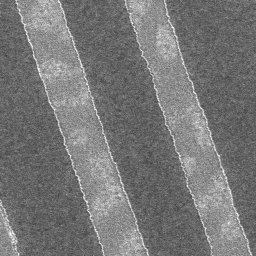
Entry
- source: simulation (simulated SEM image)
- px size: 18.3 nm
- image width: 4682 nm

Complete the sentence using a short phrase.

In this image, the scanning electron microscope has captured one or a few lines or trenches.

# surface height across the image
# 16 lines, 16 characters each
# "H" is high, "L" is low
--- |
HLLLHHHHLLHHHHHH
HLLLHHHHLLLHHHHH
HHLLLHHHHLLHHHHH
HHLLLHHHHLLHHHHH
HHLLLHHHHLLLHHHH
HHHLLLHHHHLLHHHH
HHHLLLHHHHLLHHHH
HHHHLLHHHHLLLHHH
HHHHLLLHHHHLLHHH
HHHHLLLHHHHLLLHH
HHHHHLLHHHHLLLHH
HHHHHLLLHHHHLLHH
HHHHHLLLHHHHLLHH
HHHHHHLLHHHHHLLH
LHHHHHLLLHHHHLLH
LHHHHHLLLHHHHLLL